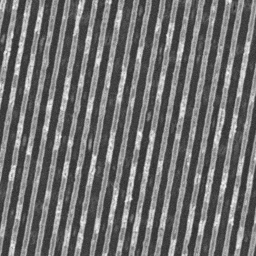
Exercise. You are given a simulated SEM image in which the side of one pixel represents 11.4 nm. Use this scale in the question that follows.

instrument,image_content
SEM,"parallel lines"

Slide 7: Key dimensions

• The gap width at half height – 95.8 nm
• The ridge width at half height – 0.0577 µm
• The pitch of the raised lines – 150 nanometers